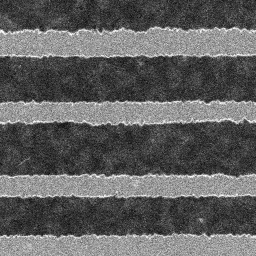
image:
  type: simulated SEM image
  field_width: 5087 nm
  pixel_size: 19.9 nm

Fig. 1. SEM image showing one or a few lines or trenches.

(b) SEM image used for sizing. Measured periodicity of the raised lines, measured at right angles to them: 1360 nm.